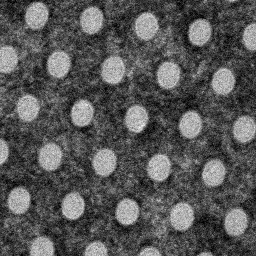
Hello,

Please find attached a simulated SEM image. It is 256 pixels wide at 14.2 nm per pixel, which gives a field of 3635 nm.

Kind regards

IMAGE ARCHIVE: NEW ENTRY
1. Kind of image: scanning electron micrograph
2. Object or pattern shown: a regular array of raised bodies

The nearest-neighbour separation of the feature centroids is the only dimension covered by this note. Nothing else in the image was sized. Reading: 762 nanometers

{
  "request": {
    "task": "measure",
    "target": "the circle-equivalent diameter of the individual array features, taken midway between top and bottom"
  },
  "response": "352 nm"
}